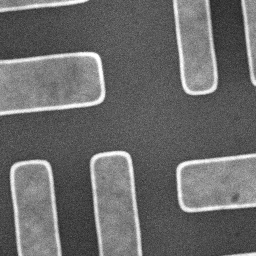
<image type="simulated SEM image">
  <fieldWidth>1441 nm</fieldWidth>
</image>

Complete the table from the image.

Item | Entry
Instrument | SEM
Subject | groups of lines, slits or small figures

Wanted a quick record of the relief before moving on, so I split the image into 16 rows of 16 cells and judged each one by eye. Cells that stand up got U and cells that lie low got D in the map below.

UUDDDDDDDDDUUDDU
DDDDDDDDDDDUUDDU
DDDDDDDDDDDUUDDU
DDDUUUDDDDDUUDDD
UUUUUUDDDDDUUUDD
UUUUUUDDDDDDUDDD
UUUUUUDDDDDDDDDD
DDDDDDDDDDDDDDDD
DDDDDDDDDDDDDDDD
DDDDDDDDDDDDDDDD
DUUDDDUUDDDUUUUU
DUUDDDUUDDDUUUUU
DUUDDDUUDDDUUUUU
DUUDDDUUUDDDDDDD
DUUUDDUUUDDDDDDD
DUUUDDUUUDDDDDDD